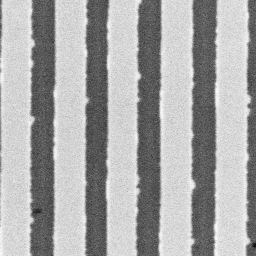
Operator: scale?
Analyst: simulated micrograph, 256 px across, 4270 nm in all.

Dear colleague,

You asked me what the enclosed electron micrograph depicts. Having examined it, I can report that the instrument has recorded lines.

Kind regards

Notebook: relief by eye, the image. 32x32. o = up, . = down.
oooo...oooo...ooo...oooo...oooo.
oooo...oooo...ooo...oooo...oooo.
oooo...oooo...ooo...oooo...oooo.
oooo...oooo...ooo...oooo...oooo.
oooo...oooo...ooo...oooo...oooo.
oooo...oooo...ooo...oooo...oooo.
oooo...oooo...ooo...oooo...oooo.
oooo...oooo...ooo...oooo...oooo.
oooo...oooo...ooo...oooo...oooo.
oooo...oooo...ooo...oooo...oooo.
oooo...oooo...ooo...oooo...oooo.
oooo...oooo...ooo...oooo...oooo.
oooo...oooo...ooo...oooo...oooo.
oooo...oooo...ooo...oooo...oooo.
oooo...oooo...ooo...oooo...oooo.
oooo...oooo...ooo...oooo...oooo.
oooo...oooo...ooo...oooo...oooo.
oooo...oooo...ooo...oooo...oooo.
oooo...oooo...ooo...oooo...oooo.
oooo...oooo...ooo...oooo...oooo.
oooo...oooo...ooo...oooo...oooo.
oooo...oooo...ooo...oooo...oooo.
oooo...oooo...ooo...oooo...oooo.
oooo...oooo...ooo...oooo...oooo.
oooo...oooo...ooo...oooo...oooo.
oooo...oooo...ooo...oooo...oooo.
oooo...oooo...ooo...oooo...oooo.
oooo...oooo...ooo...oooo...oooo.
oooo...oooo...ooo...oooo...oooo.
oooo...oooo...ooo...oooo...oooo.
oooo...oooo...ooo...oooo...oooo.
oooo...oooo...ooo...oooo...oooo.